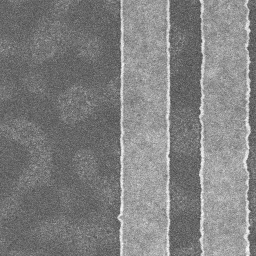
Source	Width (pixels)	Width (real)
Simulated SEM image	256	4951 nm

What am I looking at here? one or a few lines or trenches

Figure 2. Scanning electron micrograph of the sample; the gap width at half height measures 0.64 µm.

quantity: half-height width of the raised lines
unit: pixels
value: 46.2